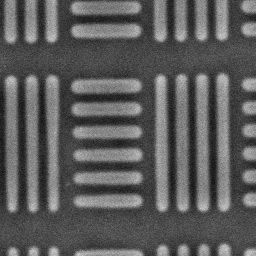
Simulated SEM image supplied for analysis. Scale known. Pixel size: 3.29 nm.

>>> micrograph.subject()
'groups of lines, slits or small figures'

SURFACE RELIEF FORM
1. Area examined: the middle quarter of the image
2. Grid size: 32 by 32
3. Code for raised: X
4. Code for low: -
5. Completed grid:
--------------------------------
--------------------------------
--------------------------------
-----------------------XX---XXX-
---XXXXXXXXXXXXXXXX----XX---XXX-
--XXXXXXXXXXXXXXXXX----XX---XXX-
--XXXXXXXXXXXXXXXXX----XX---XXX-
-----------------------XX---XXX-
-----------------------XXX--XXX-
-----------------------XXX--XXX-
--XXXXXXXXXXXXXXXXX----XXX--XXX-
--XXXXXXXXXXXXXXXXX----XXX--XXX-
---XXXXXXXX-XXXXX------XXX--XXX-
-----------------------XXX--XXX-
-----------------------XXX--XXX-
-----------------------XXX--XXX-
---XXXXXXXXXXXXXXXX----XXX--XXX-
--XXXXXXXXXXXXXXXXX----XXX--XXX-
-----------------------XXX--XXX-
-----------------------XXX--XXX-
-----------------------XXX--XXX-
--------------XXXXX----XXX--XXX-
---XXXXXXXXXXXXXXXX----XXX--XXX-
---XXXXXXXXXXXXXXXX----XXX--XXX-
-----------------------XXX--XXX-
-----------------------XXX--XXX-
-----------------------XXX--XXX-
----XXXXXXXXXXXXXXX----XXX--XXX-
---XXXXXXXXXXXXXXXX----XXX--XXX-
---XXXXXXXXXXXXXXXX----XXX--XXX-
-----------------------XXX--XXX-
-----------------------XXX--XXX-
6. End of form